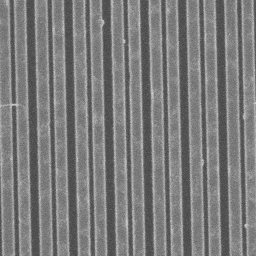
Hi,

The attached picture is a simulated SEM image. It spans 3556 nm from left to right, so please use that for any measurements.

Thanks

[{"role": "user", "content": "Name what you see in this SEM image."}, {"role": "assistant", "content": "parallel lines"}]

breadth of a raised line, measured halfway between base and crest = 160 nanometres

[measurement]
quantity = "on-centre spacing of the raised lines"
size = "19 px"